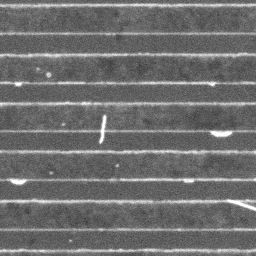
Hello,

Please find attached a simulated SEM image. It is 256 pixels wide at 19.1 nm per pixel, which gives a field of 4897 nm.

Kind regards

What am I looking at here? lines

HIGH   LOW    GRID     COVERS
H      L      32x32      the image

LLLLLLLLLLLLLLLLLLLLLLLLLLLLLLLL
HHHHHHHHHHHHHHHHHHHHHHHHHHHHHHHH
HHHHHHHHHHHHHHHHHHHHHHHHHHHHHHHH
HHHHHHHHHHHHHHHHHHHHHHHHHHHHHHHH
LLLLLLLLLLLLLLLLLLLLLLLLLLLLLLLL
LLLLLLLLLLLLLLLLLLLLLLLLLLLLLLLL
LLLLLLLLLLLLLLLLLLLLLLLLLLLLLLLL
HHHHHHHHHHHHHHHHHHHHHHHHHHHHHHHH
HHHHHHHHHHHHHHHHHHHHHHHHHHHHHHHH
HHHHHHHHHHHHHHHHHHHHHHHHHHHHHHHH
LLLLLLLLLLLLLLLLLLLLLLLLLLLLLLLL
LLLLLLLLLLLLLLLLLLLLLLLLLLLLLLLL
LLLLLLLLLLLLLLLLLLLLLLLLLLLLLLLL
HHHHHHHHHHHHHHHHHHHHHHHHHHHHHHHH
HHHHHHHHHHHHHHHHHHHHHHHHHHHHHHHH
HHHHHHHHHHHHHHHHHHHHHHHHHHHHHHHH
LLLLLLLLLLLLHLLLLLLLLLLLLLHHHLLL
LLLLLLLLLLLLLLLLLLLLLLLLLLLLLLLL
LLLLLLLLLLLLLLLLLLLLLLLLLLLLLLLL
HHHHHHHHHHHHHHHHHHHHHHHHHHHHHHHH
HHHHHHHHHHHHHHHHHHHHHHHHHHHHHHHH
HHHHHHHHHHHHHHHHHHHHHHHHHHHHHHHH
LHHLLLLLLLLLLLLLLLLLLLLLLLLLLLLL
LLLLLLLLLLLLLLLLLLLLLLLLLLLLLLLL
LLLLLLLLLLLLLLLLLLLLLLLLLLLLLLLL
HHHHHHHHHHHHHHHHHHHHHHHHHHHHHHHH
HHHHHHHHHHHHHHHHHHHHHHHHHHHHHHHH
HHHHHHHHHHHHHHHHHHHHHHHHHHHHHHHH
HHHHHHHHHHHHHHHHHHHHHHHHHHHHHHHH
LLLLLLLLLLLLLLLLLLLLLLLLLLLLLLLL
LLLLLLLLLLLLLLLLLLLLLLLLLLLLLLLL
HHHHHHHHHHHHHHHHHHHHHHHHHHHHHHHH